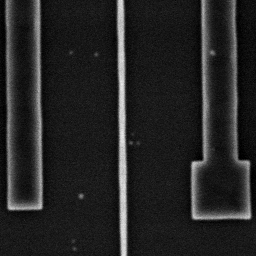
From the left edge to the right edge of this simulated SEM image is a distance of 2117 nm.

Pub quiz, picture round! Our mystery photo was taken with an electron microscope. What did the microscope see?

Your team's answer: wiring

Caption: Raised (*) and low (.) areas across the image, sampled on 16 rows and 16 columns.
**...........**.
**...........**.
**...........**.
**...........**.
**...........**.
**...........**.
***..........**.
***..........**.
***..........**.
***..........**.
***.........****
***.........****
***.........****
............***.
................
................